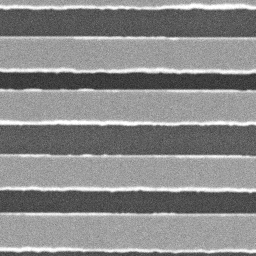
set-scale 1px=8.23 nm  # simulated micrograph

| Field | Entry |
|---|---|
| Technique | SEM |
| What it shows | lines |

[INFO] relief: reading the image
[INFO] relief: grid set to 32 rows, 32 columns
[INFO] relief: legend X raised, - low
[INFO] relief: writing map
XXXXXXXXXXXXXXXXXXXXXXXXXXXXXXXX
--------------------------------
--------------------------------
--------------------------------
--------------------------------
XXXXXXXXXXXXXXXXXXXXXXXXXXXXXXXX
XXXXXXXXXXXXXXXXXXXXXXXXXXXXXXXX
XXXXXXXXXXXXXXXXXXXXXXXXXXXXXXXX
XXXXXXXXXXXXXXXXXXXXXXXXXXXXXXXX
--------------------------------
--------------------------------
XXXXXXXXXXXXXXXXXXXXXXXXXXXXXXXX
XXXXXXXXXXXXXXXXXXXXXXXXXXXXXXXX
XXXXXXXXXXXXXXXXXXXXXXXXXXXXXXXX
XXXXXXXXXXXXXXXXXXXXXXXXXXXXXXXX
-XXXX-------XX-XXXXXXXXXXXXXXXXX
--------------------------------
--------------------------------
--------------------------------
XXXXXXX---XX-X------------------
XXXXXXXXXXXXXXXXXXXXXXXXXXXXXXXX
XXXXXXXXXXXXXXXXXXXXXXXXXXXXXXXX
XXXXXXXXXXXXXXXXXXXXXXXXXXXXXXXX
XXXXXXXXXXXXXXXXXXXXXXXXXXXXXXXX
--------------------------------
--------------------------------
--------------------------------
XXXXXXXXXXXXXXXXXXXXXXXXXXXXXXXX
XXXXXXXXXXXXXXXXXXXXXXXXXXXXXXXX
XXXXXXXXXXXXXXXXXXXXXXXXXXXXXXXX
XXXXXXXXXXXXXXXXXXXXXXXXXXXXXXXX
--------------------------X-----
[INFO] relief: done